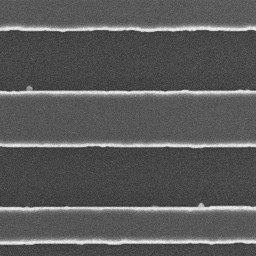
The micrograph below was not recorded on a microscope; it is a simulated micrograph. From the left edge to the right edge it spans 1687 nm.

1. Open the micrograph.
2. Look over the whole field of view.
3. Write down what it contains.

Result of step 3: lines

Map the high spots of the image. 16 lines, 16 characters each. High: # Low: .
################
################
................
................
................
................
################
################
################
................
................
................
................
################
################
................